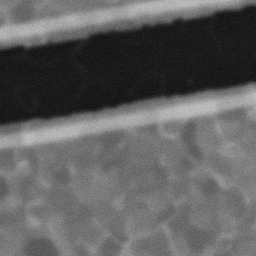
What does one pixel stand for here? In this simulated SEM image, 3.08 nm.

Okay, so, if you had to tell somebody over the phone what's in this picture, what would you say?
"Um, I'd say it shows one or a few lines or trenches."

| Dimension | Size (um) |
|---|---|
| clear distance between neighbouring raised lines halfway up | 0.33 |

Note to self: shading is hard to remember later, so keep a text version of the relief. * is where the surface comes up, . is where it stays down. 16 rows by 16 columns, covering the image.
*********.......
****............
................
................
................
................
..............**
........********
...*************
****************
****************
****************
****************
****************
****************
****************